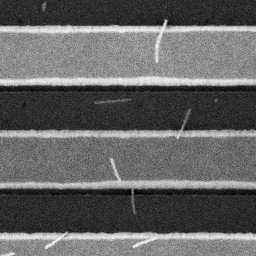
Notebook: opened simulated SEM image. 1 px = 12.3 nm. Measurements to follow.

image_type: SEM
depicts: lines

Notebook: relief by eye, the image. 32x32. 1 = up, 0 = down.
00000000000000000000000000000000
00000000000000000000000000000000
00000000000000000000000000000000
11110000111111101111111111111111
11111111111111111111111111111111
11111111111111111111111111111111
11111111111111111111111111111111
11111111111111111111111111111111
11111111111111111111111111111111
11111111111111111111111111111111
00000000000000000000000000000000
00000000000000000000000000000000
00000000000000000000000000000000
00000000000000000000000000000000
00000000000000000000000000000000
00000000000000000000000000000000
11111100011100101111011011100000
11111111111111111111111111111111
11111111111111111111111111111111
11111111111111111111111111111111
11111111111111111111111111111111
11111111111111111111111111111111
11111111111111111111111111111111
00000000000000000000000000000000
00000000000000000000000000000000
00000000000000000000000000000000
00000000000000000000000000000000
00000000000000000000000000000000
00000000000000000000000000000000
11111111111111111111111111111111
11111111111111111111111111111111
11111111111111111111111111111111